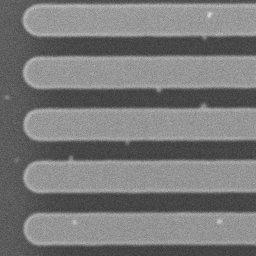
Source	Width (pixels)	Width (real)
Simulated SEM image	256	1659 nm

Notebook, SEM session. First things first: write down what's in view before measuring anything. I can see groups of lines, slits or small figures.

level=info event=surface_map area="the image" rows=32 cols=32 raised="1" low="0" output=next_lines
00000000000000000000000000000000
00011111111111111111111111111111
00011111111111111111111111111111
00011111111111111111111111111111
00000011100001111100100000000000
00000000000000000000000000000000
00000000000000000000000000000000
00001111111111111111111111111111
00011111111111111111111111111111
00011111111111111111111111111111
00001111111111111111111111111111
00000000000000000000000000000000
00000000000000000000000000000000
00000000000000000000000000000000
00011111111111111111111111111111
00011111111111111111111111111111
00011111111111111111111111111111
00000111000000110000000000000000
00000000000000000000000000000000
00000000000000000000000000000000
00001111111111111111111111111111
00011111111111111111111111111111
00011111111111111111111111111111
00001111111111111111111111111111
00000000000000000000000000000000
00000000000000000000000000000000
00000000000000000000000000000000
00011111111111111111111111111111
00011111111111111111111111111111
00011111111111111111111111111111
00001111111111111111111111111111
00000000000000000000000000000000